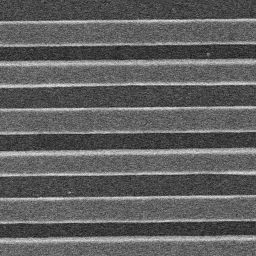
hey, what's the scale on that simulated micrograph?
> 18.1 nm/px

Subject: lines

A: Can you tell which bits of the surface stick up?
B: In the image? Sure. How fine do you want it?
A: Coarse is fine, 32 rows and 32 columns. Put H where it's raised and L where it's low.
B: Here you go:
LLLLLLLLLLLLLLLLLLLLLLLLLLLLLLLL
LLLLLLLLLLLLLLLLLLLLLLLLLLLLLLLL
LLLLLLLLLLLLLLLLLLLLLLLLLLLLLLHH
HHHHHHHHHHHHHHHHHHHHHHHHHHHHHHHH
HHHHHHHHHHHHHHHHHHHHHHHHHHHHHHHH
HHHHHHHHHHHHHHHHHHHHHHLLLLLLLLLL
LLLLLLLLLLLLLLLLLLLLLLLLLLLLLLLL
LLLLLLLLLLLLLLLLLLLLLLLLLLLLLLLL
HHHHHHHHHHHHHHHHHHHHHHHHHHHHHHHH
HHHHHHHHHHHHHHHHHHHHHHHHHHHHHHHH
HHHHHHHHHHHHHHHHHHHHHHHLLLLLLLLL
LLLLLLLLLLLLLLLLLLLLLLLLLLLLLLLL
LLLLLLLLLLLLLLLLLLLLLLLLLLLLLLLL
LLLLLLLLLLLLLLLLLLLHHHHHHHHHHHHH
HHHHHHHHHHHHHHHHHHHHHHHHHHHHHHHH
HHHHHHHHHHHHHHHHHHHHHHHHHHHHHHHH
HHHHHHHHHHHHHHHHHHHHHHHHLLLLLLLL
LLLLLLLLLLLLLLLLLLLLLLLLLLLLLLLL
LLLLLLLLLLLLLLLLLLLLLLLLLLLLLLLL
HHHHHHHHHHHHHHHHHHHHHHHHHHHHHHHH
HHHHHHHHHHHHHHHHHHHHHHHHHHHHHHHH
HHHHHHHHHHHHHHHHHHHHHHHHHHHHHHHH
LLLLLLLLLLLLLLLLLLLLLLLLLLLLLLLL
LLLLLLLLLLLLLLLLLLLLLLLLLLLLLLLL
LLLLLLLLLLLLLLLLLLLLLLLLLLLLLLLL
HHHHHHHHHHHHHHHHHHHHHHHHHHHHHHHH
HHHHHHHHHHHHHHHHHHHHHHHHHHHHHHHH
HHHHHHHHHHHHHHHHHHHHHHHHHHHHHHHH
LLLLLLLLLLLLLLLLLLLLLLLLLLLLLLLL
LLLLLLLLLLLLLLLLLLLLLLLLLLLLLLLL
HHHHHHHHHHHHHHHHHHHHHHHHHHHHHHHH
HHHHHHHHHHHHHHHHHHHHHHHHHHHHHHHH